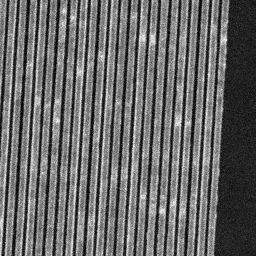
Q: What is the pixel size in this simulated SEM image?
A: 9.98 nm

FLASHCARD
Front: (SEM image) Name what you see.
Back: parallel lines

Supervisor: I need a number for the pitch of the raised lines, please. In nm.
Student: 101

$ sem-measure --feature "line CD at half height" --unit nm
58.5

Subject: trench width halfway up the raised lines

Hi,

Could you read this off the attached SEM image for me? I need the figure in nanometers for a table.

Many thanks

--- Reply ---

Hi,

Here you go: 38.6